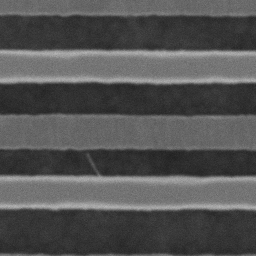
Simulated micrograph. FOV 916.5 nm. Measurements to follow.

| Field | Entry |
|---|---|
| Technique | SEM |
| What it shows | lines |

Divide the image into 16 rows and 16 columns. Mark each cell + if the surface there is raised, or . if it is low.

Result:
++++++++++++++++
................
................
++++++++++++++++
++++++++++++++++
................
................
++++++++++++++++
++++++++++++++++
................
................
++++++++++++++++
++++++++++++++++
................
................
................